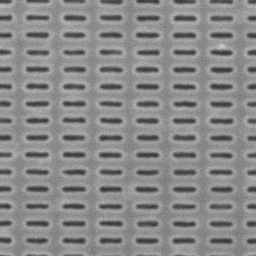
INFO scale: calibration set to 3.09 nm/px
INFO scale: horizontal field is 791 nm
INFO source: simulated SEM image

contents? a regular array of holes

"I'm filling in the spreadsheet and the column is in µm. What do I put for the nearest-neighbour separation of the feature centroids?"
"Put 0.0528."